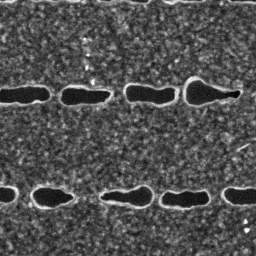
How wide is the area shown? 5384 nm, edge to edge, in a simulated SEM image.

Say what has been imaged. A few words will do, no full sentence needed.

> holes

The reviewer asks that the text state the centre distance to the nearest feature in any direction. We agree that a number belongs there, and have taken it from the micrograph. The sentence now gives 1190 nm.